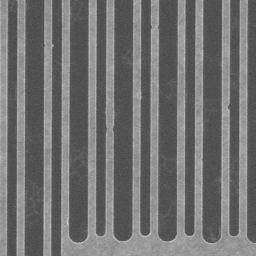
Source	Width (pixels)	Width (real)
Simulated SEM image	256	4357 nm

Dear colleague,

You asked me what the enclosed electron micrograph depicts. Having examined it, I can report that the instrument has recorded parallel lines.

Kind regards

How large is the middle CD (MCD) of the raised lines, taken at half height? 123 nm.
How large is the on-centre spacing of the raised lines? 382 nm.